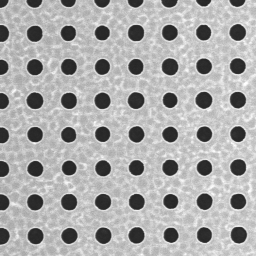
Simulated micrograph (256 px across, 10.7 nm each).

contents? a regular array of holes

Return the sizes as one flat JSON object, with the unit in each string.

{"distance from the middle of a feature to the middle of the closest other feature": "358 nm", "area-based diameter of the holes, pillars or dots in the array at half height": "175 nm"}